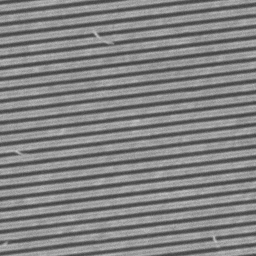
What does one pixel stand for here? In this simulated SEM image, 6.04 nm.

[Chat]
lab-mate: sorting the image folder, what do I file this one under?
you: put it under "parallel lines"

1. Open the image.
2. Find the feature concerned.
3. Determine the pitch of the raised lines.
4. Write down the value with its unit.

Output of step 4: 65.5 nm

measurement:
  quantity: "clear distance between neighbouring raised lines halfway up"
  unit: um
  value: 0.0277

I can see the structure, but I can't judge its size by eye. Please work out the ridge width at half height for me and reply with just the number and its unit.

33.7 nanometres